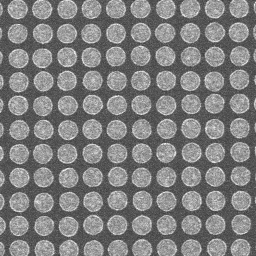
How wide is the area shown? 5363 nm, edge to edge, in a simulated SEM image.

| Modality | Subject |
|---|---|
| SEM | a regular array of raised bodies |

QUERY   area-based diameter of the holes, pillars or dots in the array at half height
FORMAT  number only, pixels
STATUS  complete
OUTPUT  19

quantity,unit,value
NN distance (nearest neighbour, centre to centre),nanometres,496